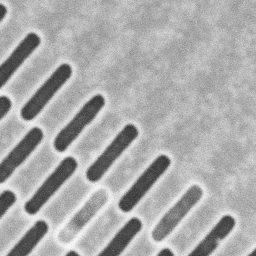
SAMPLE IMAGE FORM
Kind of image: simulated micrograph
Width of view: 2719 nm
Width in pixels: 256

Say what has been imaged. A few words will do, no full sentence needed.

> holes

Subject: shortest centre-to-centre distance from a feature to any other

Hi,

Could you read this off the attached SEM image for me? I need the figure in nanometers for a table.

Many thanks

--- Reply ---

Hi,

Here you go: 473